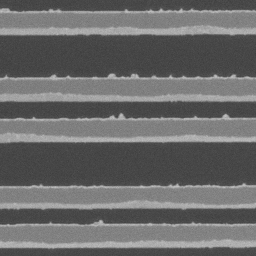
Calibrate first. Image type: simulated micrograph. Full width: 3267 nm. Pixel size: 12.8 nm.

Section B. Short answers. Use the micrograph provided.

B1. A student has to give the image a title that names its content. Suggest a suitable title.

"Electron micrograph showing lines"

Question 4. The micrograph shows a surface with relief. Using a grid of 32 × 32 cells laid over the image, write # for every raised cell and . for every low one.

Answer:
................................
################################
################################
################################
................................
................................
................................
................................
................................
................................
################################
################################
................................
................................
................................
################################
################################
................................
................................
................................
................................
................................
................................
################################
################################
################################
................................
................................
################################
################################
##################..######......
................................